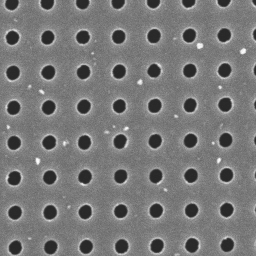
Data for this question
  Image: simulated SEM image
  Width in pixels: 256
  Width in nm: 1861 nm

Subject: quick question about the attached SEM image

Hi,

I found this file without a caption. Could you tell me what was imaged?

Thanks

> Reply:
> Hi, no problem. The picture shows a regular array of holes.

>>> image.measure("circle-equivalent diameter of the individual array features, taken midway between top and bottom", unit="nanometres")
102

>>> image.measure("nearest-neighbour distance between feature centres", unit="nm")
252